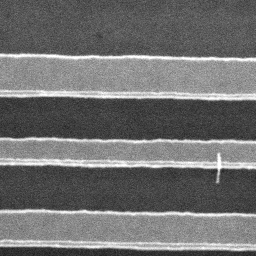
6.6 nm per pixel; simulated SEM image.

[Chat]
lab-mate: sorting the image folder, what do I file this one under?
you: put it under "lines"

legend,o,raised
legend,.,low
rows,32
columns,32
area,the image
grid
................................
................................
................................
................................
................................
................................
................................
oooooooooooooooooooooooooooooooo
oooooooooooooooooooooooooooooooo
oooooooooooooooooooooooooooooooo
oooooooooooooooooooooooooooooooo
oooooooooooooooooooooooooooooooo
................................
................................
................................
................................
................................
oooooooooo......................
oooooooooooooooooooooooooooooooo
oooooooooooooooooooooooooooooooo
oooooo.ooooooooooooooooooooooooo
................................
................................
................................
................................
................................
..ooooo...o.....................
oooooooooooooooooooooooooooooooo
oooooooooooooooooooooooooooooooo
oooooooooooooooooooooooooooooooo
oooooooooooooooooooooooooooooooo
................................